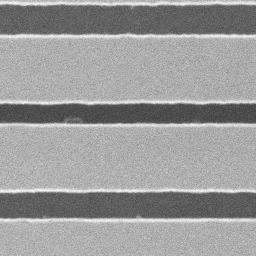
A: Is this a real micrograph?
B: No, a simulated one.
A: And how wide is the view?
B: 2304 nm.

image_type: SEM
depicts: lines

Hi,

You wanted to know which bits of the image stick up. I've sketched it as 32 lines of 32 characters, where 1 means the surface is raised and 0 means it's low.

01111110111111111111111111111111
00000000000000000000000000000000
00000000000000000000000000000000
00000000000000000000000000000000
11111111111111111111111111111111
11111111111111111111111111111111
11111111111111111111111111111111
11111111111111111111111111111111
11111111111111111111111111111111
11111111111111111111111111111111
11111111111111111111111111111111
11111111111111111111111111111111
11111111111111111111111111111111
00000000000000000000000000000000
00000000000000000000000000000000
01100011000000000000000011101000
11111111111111111111111111111111
11111111111111111111111111111111
11111111111111111111111111111111
11111111111111111111111111111111
11111111111111111111111111111111
11111111111111111111111111111111
11111111111111111111111111111111
11111111111111111111111111111111
00000000000000000000000000000000
00000000000000000000000000000000
00000000000000000000000000000000
11111111111111111111111111111111
11111111111111111111111111111111
11111111111111111111111111111111
11111111111111111111111111111111
11111111111111111111111111111111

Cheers